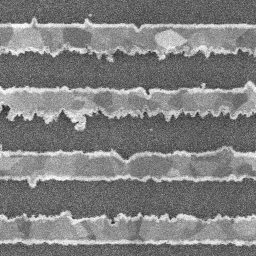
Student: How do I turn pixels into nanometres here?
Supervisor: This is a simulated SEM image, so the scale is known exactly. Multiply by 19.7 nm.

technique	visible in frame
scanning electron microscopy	one or a few lines or trenches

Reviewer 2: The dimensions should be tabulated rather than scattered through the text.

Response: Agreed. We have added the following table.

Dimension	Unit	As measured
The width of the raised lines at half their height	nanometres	489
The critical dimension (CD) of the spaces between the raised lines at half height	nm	770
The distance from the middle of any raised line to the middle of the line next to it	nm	1260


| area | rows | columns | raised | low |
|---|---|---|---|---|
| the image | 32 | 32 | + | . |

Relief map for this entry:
................................
................................
................................
+++++++++++++++++.++++++++++++++
++++++++++++++++++++++++++++++++
++++++++++++++++++++++++++++++++
......+...+.++.....++.++....+..+
................................
................................
................................
................................
++++++++++++++++++.+++++++++++++
++++++++++++++++++++++++++++++++
.+++++++++++++++++++++++++++++++
.+.+.++..+...................+..
................................
................................
................................
................................
+++++++++++++++..+++++++++++++++
++++++++++++++++++++++++++++++++
++++++++++++++++++++++++++++++++
...++............+..............
................................
................................
................................
................................
+++++++++.++++.++++++++++.++++++
++++++++++++++++++++++++++++++++
++++++++++++++++++++++++++++++++
................................
................................